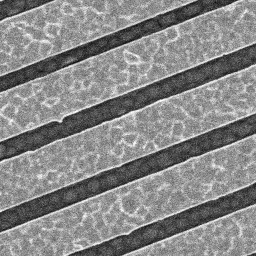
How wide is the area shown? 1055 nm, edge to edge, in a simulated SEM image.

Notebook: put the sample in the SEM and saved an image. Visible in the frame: one or a few lines or trenches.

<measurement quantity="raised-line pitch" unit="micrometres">0.269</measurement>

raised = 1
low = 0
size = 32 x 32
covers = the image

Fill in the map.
00000011111111111111111000000111
00011111111111111111100000111111
11111111111111111100000011111111
11111111111111100000011111111111
11111111111110000011111111111111
11111111110000001111111111111111
11111111000001111111111111111000
11111000000111111111111111000000
11100000111111111111111100000001
00000011111111111111100000001111
00011111111111111110000000111111
11111111111111110000000111111111
11111111111110000000111111111111
11111111111000000011111111111111
11111111000000011111111111111110
11111100000001111111111111110000
11100000001111111111111111000000
00000001111111111111111000000011
00000111111111111111100000001111
00111111111111111100000001111111
11111111111111100000000111111111
11111111111110000000111111111111
11111111110000000111111111111111
11111111000000011111111111111100
11111000000011111111111111110000
11100000001111111111111110000000
00000001111111111111110000000111
00001111111111111111000000011111
00111111111111111000000011111111
11111111111111100000001111111111
11111111111100000001111111111111
11111111100000000111111111111111